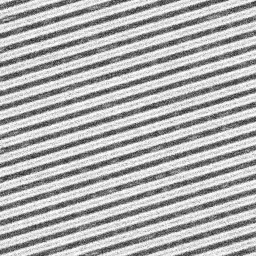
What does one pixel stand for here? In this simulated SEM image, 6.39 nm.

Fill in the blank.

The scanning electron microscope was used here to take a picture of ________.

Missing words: parallel lines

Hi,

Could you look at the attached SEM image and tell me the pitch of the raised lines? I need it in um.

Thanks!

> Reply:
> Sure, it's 0.0884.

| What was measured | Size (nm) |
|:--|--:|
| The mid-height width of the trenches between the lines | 49.8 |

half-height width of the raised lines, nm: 38.3